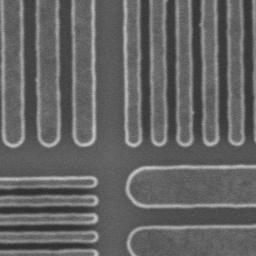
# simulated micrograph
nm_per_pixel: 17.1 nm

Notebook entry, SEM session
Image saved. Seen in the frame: groups of lines, slits or small figures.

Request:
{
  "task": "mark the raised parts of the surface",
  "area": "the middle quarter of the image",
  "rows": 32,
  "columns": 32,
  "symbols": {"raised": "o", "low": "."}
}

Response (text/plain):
..ooooo........oooo...ooo...oooo
...oooo........oooo...ooo...oooo
...oooo........oooo...ooo...oooo
...oooo........oooo...ooo...oooo
...oooo.........ooo...ooo...oooo
...oooo.........ooo...ooo...oooo
...oooo.........ooo...ooo....ooo
...oooo.........ooo...ooo....ooo
..ooooo.........ooo...ooo....ooo
...oooo.........ooo...ooo....ooo
...oooo.........ooo...ooo....ooo
...oooo.........ooo...ooo....ooo
...oooo.........ooo...ooo...oooo
...oooo.........ooo...ooo...oooo
...oooo.........ooo...ooo....ooo
...oooo.........ooo...ooo....ooo
...oooo.........ooo...ooo....ooo
...oooo.........ooo...ooo....ooo
...oooo.........ooo...ooo....ooo
...oooo.........ooo....oo....ooo
................................
................................
................................
................................
................................
................................
...................ooooooooooooo
.................ooooooooooooooo
................oooooooooooooooo
oooooooo........oooooooooooooooo
ooooooo.........oooooooooooooooo
................oooooooooooooooo